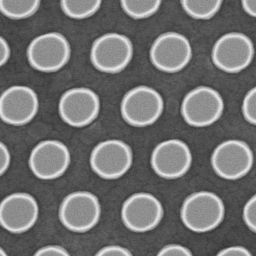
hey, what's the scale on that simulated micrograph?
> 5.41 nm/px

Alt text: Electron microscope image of a regular array of raised bodies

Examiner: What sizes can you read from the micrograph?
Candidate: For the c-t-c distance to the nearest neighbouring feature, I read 326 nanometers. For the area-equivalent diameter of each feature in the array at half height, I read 207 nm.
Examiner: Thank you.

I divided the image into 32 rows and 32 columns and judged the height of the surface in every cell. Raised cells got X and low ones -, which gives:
XXXXX---XXXX---XXXXX---XXXX---XX
XXXX----XXXX----XXX----XXXX----X
--------------------------------
--------------------------------
-----XX------XX-----XXX-----XX--
X---XXXX----XXXX---XXXXX---XXXX-
X---XXXXX--XXXXX---XXXXX---XXXX-
X---XXXX----XXXX---XXXX----XXXX-
-----XX-----XXX-----XXX-----XX--
--------------------------------
--------------------------------
-XXX-----XX-----XXX-----XXX----X
XXXXX---XXXX---XXXXX---XXXXX---X
XXXX----XXXX---XXXXX---XXXXX---X
XXXX----XXXX---XXXXX---XXXX----X
---------XX------X------XX------
--------------------------------
--------------------------------
X---XXXX----XXXX----XXX----XXXX-
X---XXXXX--XXXXX---XXXXX---XXXX-
X---XXXX---XXXXX---XXXXX---XXXX-
----XXXX----XXX-----XXX----XXXX-
--------------------------------
--------------------------------
-XXX-----XXX-----XX-----XXX-----
XXXX----XXXX----XXXX---XXXXX---X
XXXXX---XXXX---XXXXX---XXXXX--XX
XXXX----XXXX---XXXXX---XXXXX---X
-XX------XX-----XXX-----XXX-----
--------------------------------
--------------------------------
-----XXX-----XXX----XXX-----XXX-